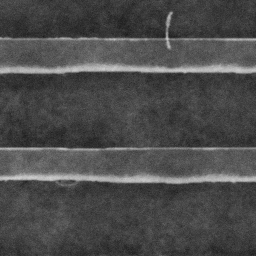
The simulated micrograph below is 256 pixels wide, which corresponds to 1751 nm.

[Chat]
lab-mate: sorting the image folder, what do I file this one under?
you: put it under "lines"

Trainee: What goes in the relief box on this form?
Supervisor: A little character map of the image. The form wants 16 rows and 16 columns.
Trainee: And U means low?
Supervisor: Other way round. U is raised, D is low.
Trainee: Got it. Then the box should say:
DDDDDDDDDDDDDDDD
DDDDDDDDDDDDDDDD
UUUUUUUUUUUUUUUU
UUUUUUUUUUUUUUUU
DDDDDDDDDDDDDDDD
DDDDDDDDDDDDDDDD
DDDDDDDDDDDDDDDD
DDDDDDDDDDDDDDDD
DDDDDDDDDDDDDDDD
UUUUUUUUUUUUUUUU
UUUUUUUUUUUUUUUU
DDDDDDDDDDDDDDDD
DDDDDDDDDDDDDDDD
DDDDDDDDDDDDDDDD
DDDDDDDDDDDDDDDD
DDDDDDDDDDDDDDDD